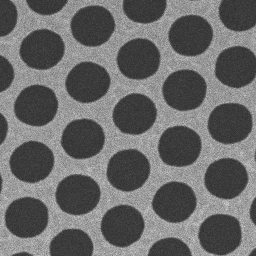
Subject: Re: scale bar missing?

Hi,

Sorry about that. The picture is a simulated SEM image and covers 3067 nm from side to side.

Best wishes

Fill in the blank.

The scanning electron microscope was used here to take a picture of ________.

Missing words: a regular array of holes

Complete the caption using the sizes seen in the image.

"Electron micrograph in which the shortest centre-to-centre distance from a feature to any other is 0.662 um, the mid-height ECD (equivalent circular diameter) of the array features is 518 nanometres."